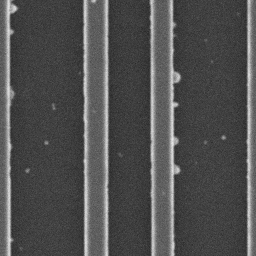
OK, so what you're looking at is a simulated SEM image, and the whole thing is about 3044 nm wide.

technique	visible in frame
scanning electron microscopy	lines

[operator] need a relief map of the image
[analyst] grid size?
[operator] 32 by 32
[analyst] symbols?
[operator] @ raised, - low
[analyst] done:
@----------@@------@@@---------@
@----------@@------@@@---------@
@----------@@------@@@---------@
@----------@@------@@@---------@
@----------@@------@@@---------@
@----------@@------@@@---------@
@----------@@------@@@---------@
@----------@@------@@@---------@
@----------@@------@@@---------@
@----------@@------@@@---------@
@----------@@------@@@---------@
@----------@@------@@@---------@
@----------@@------@@@---------@
@----------@@------@@@---------@
@----------@@------@@@---------@
@----------@@------@@@---------@
@----------@@------@@@---------@
@----------@@------@@@---------@
@----------@@------@@@---------@
@----------@@------@@@---------@
@----------@@------@@@---------@
@----------@@------@@@---------@
@----------@@------@@@---------@
@----------@@------@@@---------@
@----------@@------@@@---------@
@----------@@------@@@---------@
@----------@@------@@@---------@
@----------@@------@@@---------@
@----------@@------@@@---------@
@----------@@------@@@---------@
@----------@@------@@@---------@
@----------@@------@@@---------@